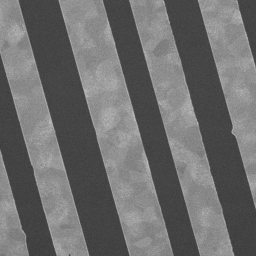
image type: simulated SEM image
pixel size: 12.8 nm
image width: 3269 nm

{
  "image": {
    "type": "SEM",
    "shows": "one or a few lines or trenches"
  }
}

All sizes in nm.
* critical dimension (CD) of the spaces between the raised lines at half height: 426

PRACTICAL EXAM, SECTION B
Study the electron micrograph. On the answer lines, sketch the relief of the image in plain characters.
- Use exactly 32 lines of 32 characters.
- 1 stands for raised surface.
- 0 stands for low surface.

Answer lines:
11000000111110001111100001111100
11100000111110000111100001111100
11100000111110000111100000111100
11100000111111000111100000111100
11100000011111000111110000111110
11110000011111000011110000111110
11110000011111100011110000011110
11110000011111100011111000011111
01111000001111100001111000011111
01111000001111100001111000011111
01111000001111110001111000001111
01111000000111110001111100001111
00111100000111110000111100001111
00111100000111111000111100000111
00111100000111111000111100000111
00011110000011111000011110000111
00011110000011111000011110000111
00011110000011111100011110000011
00011110000001111100011111000011
00001111000001111100001111000011
00001111000001111100001111000011
10001111000001111110001111000001
10000111000000111110001111100001
10000111100000111110000111100001
11000111100000111111000111100000
11000111100000011111000111110000
11000011110000011111000011110000
11000011110000011111000011110000
11100011110000011111100011110000
11100011110000001111100011110000
11100001011000001111100001110000
11100001011000001110110001110000